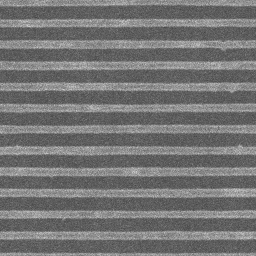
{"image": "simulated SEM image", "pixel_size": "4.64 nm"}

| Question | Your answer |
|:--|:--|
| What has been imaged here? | parallel lines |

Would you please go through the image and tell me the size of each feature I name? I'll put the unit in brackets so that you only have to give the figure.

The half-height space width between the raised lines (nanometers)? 66.1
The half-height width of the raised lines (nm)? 33.1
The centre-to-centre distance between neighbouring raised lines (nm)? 98.5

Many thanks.